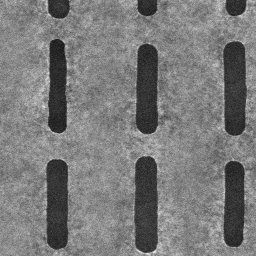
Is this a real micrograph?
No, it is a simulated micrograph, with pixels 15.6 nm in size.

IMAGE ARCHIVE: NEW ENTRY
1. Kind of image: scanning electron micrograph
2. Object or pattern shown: holes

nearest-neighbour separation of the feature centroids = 1.37 micrometres